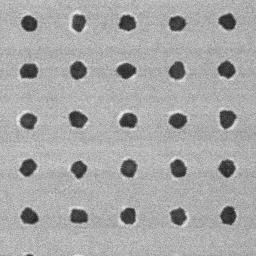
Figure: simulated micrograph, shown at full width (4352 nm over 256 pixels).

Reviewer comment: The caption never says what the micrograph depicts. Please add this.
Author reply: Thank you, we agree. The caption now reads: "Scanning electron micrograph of a regular array of holes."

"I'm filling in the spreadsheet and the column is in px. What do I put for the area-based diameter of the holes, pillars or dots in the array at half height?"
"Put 18.1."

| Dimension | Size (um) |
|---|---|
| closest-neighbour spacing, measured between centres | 0.814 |